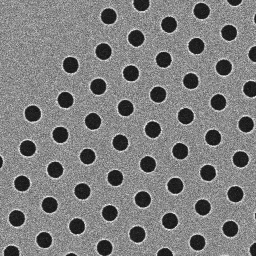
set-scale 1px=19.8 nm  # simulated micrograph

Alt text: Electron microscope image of a regular array of holes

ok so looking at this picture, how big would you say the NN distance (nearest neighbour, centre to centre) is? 689 nm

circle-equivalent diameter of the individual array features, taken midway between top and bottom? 324 nm